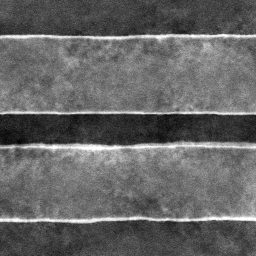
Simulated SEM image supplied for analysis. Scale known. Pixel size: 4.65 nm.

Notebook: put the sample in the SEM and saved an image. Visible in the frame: lines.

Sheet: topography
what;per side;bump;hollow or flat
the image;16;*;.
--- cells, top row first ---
................
................
****************
****************
****************
****************
****************
................
................
****************
****************
****************
****************
****************
................
................